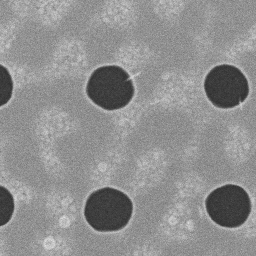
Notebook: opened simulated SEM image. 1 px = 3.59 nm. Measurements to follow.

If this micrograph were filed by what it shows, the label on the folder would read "holes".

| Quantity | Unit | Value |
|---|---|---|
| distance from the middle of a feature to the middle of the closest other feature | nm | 423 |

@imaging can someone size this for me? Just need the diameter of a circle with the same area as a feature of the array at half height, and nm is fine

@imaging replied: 159